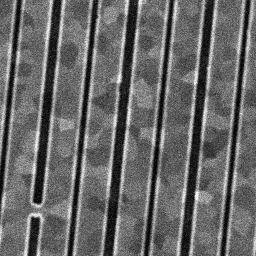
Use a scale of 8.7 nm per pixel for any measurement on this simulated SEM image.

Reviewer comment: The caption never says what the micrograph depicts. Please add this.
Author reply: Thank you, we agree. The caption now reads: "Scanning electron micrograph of parallel lines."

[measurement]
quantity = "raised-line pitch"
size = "0.333 microns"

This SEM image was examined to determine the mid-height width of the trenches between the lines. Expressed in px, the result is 7.97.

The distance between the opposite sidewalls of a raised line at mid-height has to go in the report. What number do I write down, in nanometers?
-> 244